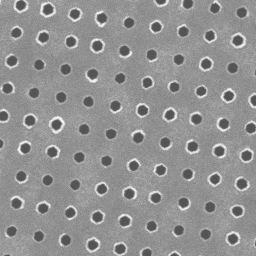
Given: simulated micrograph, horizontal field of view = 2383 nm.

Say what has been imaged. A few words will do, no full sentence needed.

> a regular array of holes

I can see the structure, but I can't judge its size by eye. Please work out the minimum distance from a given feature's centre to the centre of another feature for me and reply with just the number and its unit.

254 nm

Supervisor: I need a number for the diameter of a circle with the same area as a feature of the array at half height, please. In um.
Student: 0.0945